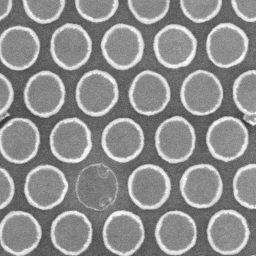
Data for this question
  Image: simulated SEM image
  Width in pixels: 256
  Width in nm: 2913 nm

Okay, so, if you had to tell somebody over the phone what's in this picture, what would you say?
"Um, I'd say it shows a regular array of raised bodies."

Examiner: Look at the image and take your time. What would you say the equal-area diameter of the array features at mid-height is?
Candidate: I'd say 465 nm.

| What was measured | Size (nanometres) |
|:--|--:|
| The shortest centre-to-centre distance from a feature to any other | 592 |